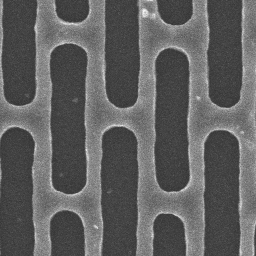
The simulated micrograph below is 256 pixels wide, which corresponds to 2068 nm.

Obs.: holes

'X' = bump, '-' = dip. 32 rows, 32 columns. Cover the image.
-----XX----XX----XXX----XX----XX
-----XX----XX-----XX----XX----XX
----XXXX--XXX----XXX----XX----XX
----XXXXXXXXX----XXXXXXXXX----XX
----XXXXXXXXX----XXXXXXXXX----XX
----XXXX-XXXX----XXXXXXXXX----XX
-----XX----XX-----XX---XXX----XX
-----X-----XX-----X-----XX----XX
-----X-----XX-----X-----XX----XX
----XX-----XX----XX-----XX----XX
-----X-----XX----XX-----XX----XX
-----X-----XX----XX-----XX----XX
X---XX-----XXX---XX-----XX----XX
XXXXXX-----XXXX-XXX-----XXXXXXXX
XXXXXX-----XXXXXXXX-----XXXXXXXX
XXXXXX-----XXXXXXXX----XXXXXXXXX
X---XX-----XX----XX----XXXX--XXX
----XX-----XX----XX-----XX----XX
----XX-----XX----XX-----X-----XX
----XX-----XX----XX-----X-----XX
----XX-----XX----XX-----XX----XX
----XX-----X-----XX-----XX----XX
----XX-----XX----XXX----X-----XX
----XXX---XXX----XXX---XX-----XX
----XXXXXXXXX----XXXXXXXX-----XX
----XXXXXXXXX----XXXXXXXXX----XX
----XXX--XXXX----XXXXXXXXX----XX
----XX----XXX----XX----XXX----XX
----XX----XXX----XX----XXX----XX
----XX-----XX----XX----XX-----XX
----XX-----XX----XX----XX-----XX
----XX-----XX----XX----XX-----XX